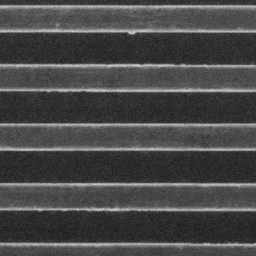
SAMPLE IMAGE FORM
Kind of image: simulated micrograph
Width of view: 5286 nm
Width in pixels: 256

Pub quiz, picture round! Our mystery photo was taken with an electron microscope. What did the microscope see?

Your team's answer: lines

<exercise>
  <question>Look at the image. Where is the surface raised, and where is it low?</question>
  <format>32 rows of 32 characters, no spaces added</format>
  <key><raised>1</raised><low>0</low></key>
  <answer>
00000000000000000000000000000000
11111111111111111111111111111111
11111111111111111111111111111111
11111111111111111111111111111111
00000000000000000000000000000000
00000000000000000000000000000000
00000000000000000000000000000000
00000000000000000000000000000000
11111111111111111111111111111111
11111111111111111111111111111111
11111111111111111111111111111111
00000000000000000000000000000000
00000000000000000000000000000000
00000000000000000000000000000000
00000000000000000000000000000000
00000000000000000000000000000000
11111111111111111111111111111111
11111111111111111111111111111111
11111111111111111111111111111111
00000000000000000000000000000000
00000000000000000000000000000000
00000000000000000000000000000000
00000000000000000000000000000000
11111111111111111111111111111111
11111111111111111111111111111111
11111111111111111111111111111111
00000000000000000000000000000000
00000000000000000000000000000000
00000000000000000000000000000000
00000000000000000000000000000000
00000000000000000000000000000000
11111111111111111111111111111111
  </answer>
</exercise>